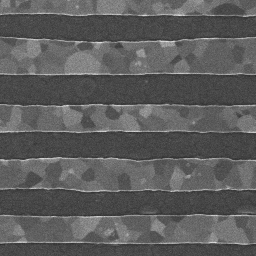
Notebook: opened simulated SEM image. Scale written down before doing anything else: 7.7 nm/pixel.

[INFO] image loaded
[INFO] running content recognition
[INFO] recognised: one or a few lines or trenches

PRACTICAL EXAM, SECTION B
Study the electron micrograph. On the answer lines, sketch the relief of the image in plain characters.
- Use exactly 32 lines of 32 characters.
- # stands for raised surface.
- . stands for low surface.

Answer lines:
################################
################################
................................
...................#............
...................#............
################################
################################
################################
################################
............................#...
..........#.....................
..........##....................
................................
################################
################################
################################
........####....#.......##.##..#
................................
................................
................................
################################
################################
################################
####.###########################
................................
................................
..................##..........##
################################
################################
################################
.................#...##.......##
................................